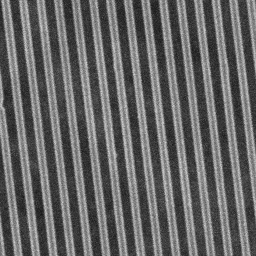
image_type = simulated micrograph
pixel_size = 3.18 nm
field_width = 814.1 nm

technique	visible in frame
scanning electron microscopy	parallel lines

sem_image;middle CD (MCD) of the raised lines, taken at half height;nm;19.7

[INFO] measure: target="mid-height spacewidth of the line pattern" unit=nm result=36.7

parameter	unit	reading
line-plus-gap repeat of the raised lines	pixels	17.4